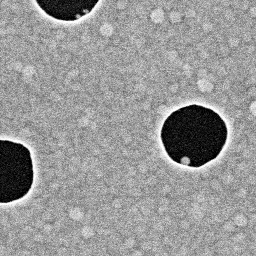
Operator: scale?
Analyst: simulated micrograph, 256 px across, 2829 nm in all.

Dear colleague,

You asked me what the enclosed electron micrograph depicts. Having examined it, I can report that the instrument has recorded holes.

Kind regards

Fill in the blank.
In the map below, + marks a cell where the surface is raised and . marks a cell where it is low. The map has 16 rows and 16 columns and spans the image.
+++...++++++++++
++++++++++++++++
++++++++++++++++
++++++++++++++++
++++++++++++++++
++++++++++++++++
++++++++++++++++
++++++++++....++
++++++++++....++
..++++++++....++
..++++++++++++++
..++++++++++++++
.+++++++++++++++
++++++++++++++++
++++++++++++++++
++++++++++++++++